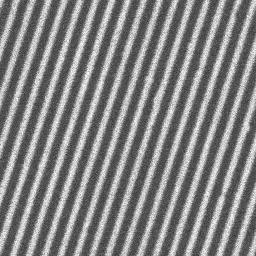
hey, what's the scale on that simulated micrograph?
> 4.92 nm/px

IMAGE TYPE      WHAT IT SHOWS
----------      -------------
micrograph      parallel lines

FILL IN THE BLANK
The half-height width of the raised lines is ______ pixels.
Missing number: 5.59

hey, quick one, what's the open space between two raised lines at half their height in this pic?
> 45.6 nm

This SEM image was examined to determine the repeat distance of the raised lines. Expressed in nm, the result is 74.3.